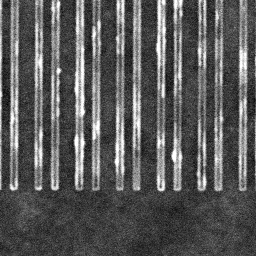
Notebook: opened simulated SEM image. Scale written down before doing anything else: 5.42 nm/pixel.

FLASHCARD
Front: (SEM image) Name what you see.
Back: parallel lines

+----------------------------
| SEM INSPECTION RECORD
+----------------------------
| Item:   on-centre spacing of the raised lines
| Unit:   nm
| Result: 113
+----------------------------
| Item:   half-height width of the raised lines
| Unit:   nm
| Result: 35.9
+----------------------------